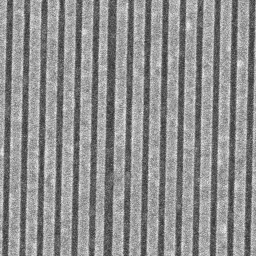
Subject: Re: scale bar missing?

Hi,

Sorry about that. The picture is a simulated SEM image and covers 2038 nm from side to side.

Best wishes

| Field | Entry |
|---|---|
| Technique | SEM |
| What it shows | parallel lines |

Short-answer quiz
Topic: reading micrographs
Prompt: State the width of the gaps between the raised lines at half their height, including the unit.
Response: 52.7 nm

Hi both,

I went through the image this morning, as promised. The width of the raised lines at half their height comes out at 84.5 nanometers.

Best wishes